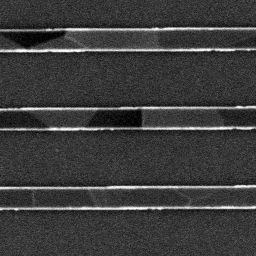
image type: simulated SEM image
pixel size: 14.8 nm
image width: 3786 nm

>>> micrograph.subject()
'lines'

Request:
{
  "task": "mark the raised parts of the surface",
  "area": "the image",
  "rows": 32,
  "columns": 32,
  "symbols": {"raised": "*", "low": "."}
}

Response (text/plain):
................................
................................
................................
................................
********************************
********************************
................................
................................
................................
................................
................................
................................
................................
...............*****************
********************************
********************************
................................
................................
................................
................................
................................
................................
................................
********************************
********************************
********************************
................................
................................
................................
................................
................................
................................